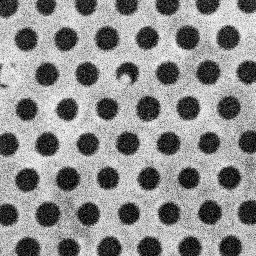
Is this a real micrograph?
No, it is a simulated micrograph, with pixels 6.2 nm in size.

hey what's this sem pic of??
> a regular array of holes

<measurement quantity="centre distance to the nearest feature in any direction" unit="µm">0.249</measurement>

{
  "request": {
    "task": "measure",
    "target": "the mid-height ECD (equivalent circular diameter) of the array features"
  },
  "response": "155 nm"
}